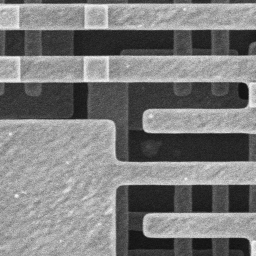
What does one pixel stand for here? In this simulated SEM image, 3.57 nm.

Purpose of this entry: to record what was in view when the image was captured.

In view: wiring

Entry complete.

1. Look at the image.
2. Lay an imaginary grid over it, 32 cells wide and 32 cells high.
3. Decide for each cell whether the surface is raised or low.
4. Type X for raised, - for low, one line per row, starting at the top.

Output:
X--XXX----XXXXXX-----XXX--XXXXXX
XXXXXXXXXXXXXXXXXXXXXXXXXXXXXXXX
XXXXXXXXXXXXXXXXXXXXXXXXXXXXXXXX
XXXXXXXXXXXXXXXXXXXXXXXXXXXXXXXX
X--XX-----------------XX--XXX---
X--XX-----------------XX--XXX--X
X--XX-----------------XX---XX--X
XXXXXXXXXXXXXXXXXXXXXXXXXXXXXXXX
XXXXXXXXXXXXXXXXXXXXXXXXXXXXXXXX
XXXXXXXXXXXXXXXXXXXXXXXXXXXXXXXX
X--XXX-----XXXXX------XX--XXX--X
---XX------XXXXX------XX---X---X
-----------XXXXX---------------X
-----------XXXXX--------------XX
-----------XXXXX--XXXXXXXXXXXXXX
XXXXXXXXXXXXXXXX--XXXXXXXXXXXXXX
XXXXXXXXXXXXXXXX--XXXXXXXXXXXXXX
XXXXXXXXXXXXXXXX---------------X
XXXXXXXXXXXXXXXX---------------X
XXXXXXXXXXXXXXXX---------------X
XXXXXXXXXXXXXXXXXXXXXXXXXXXXXXXX
XXXXXXXXXXXXXXXXXXXXXXXXXXXXXXXX
XXXXXXXXXXXXXXXXXXXXXXXXXXXXXXXX
XXXXXXXXXXXXXXXX------XX--XXX--X
XXXXXXXXXXXXXXXX------XX---X---X
XXXXXXXXXXXXXXXX------XX---X---X
XXXXXXXXXXXXXXXX-----XXX--XXX--X
XXXXXXXXXXXXXXXX--XXXXXXXXXXXXXX
XXXXXXXXXXXXXXXX--XXXXXXXXXXXXXX
XXXXXXXXXXXXXXXX--XXXXXXXXXXXXXX
XXXXXXXXXXXXXXXX------XX---X---X
XXXXXXXXXXXXXXXX------XX---X---X